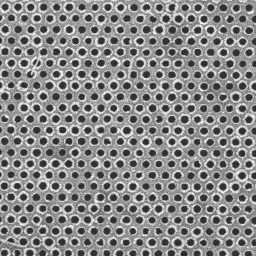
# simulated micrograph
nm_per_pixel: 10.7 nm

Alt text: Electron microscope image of a regular array of holes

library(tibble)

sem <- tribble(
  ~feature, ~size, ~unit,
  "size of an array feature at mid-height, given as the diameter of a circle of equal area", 75.7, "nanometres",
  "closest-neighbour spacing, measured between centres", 134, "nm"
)